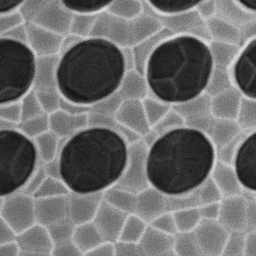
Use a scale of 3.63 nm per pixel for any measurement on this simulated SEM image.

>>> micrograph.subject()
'holes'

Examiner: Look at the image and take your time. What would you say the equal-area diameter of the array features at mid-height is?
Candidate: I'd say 65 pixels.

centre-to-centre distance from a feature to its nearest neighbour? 320 nanometers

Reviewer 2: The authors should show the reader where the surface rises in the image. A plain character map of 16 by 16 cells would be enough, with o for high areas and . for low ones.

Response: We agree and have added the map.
.ooo..oooo..oooo
oooooooooooooooo
.oooooooooo.oooo
..oo....oo...oo.
..oo....o....oo.
..oo...oo....oo.
oooooooooooooooo
oooooooooooooooo
.oooo..ooo...ooo
..oo....o....oo.
..oo....o....oo.
.ooo...ooo..ooo.
oooooooooooooooo
oooooooooooooooo
oooooooooooooooo
oooooooooooooooo